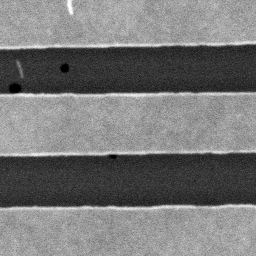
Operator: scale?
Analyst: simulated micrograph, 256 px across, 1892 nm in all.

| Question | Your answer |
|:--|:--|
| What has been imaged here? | lines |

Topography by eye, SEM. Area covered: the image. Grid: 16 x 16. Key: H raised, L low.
HHHHHHHHHHHHHHHH
HHHHHHHHHHHHHHHH
HHHHHHHHHHHHHHHH
LLLLLLLLLLLLLLLL
LLLLLLLLLLLLLLLL
LLLLLLLLLLLLLLLL
HHHHHHHHHHHHHHHH
HHHHHHHHHHHHHHHH
HHHHHHHHHHHHHHHH
HHHHHHHHHHHHHHHL
LLLLLLLLLLLLLLLL
LLLLLLLLLLLLLLLL
LLLLLLLLLLLLLLLL
HHHHHHHHHHHHHHHH
HHHHHHHHHHHHHHHH
HHHHHHHHHHHHHHHH